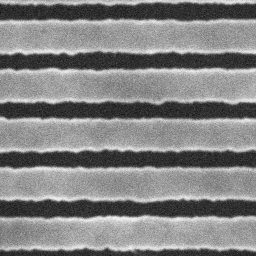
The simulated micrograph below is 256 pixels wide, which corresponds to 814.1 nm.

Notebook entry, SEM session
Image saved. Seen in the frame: lines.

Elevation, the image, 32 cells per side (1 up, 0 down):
00001110110001001000000000000000
00000000000000000000000000000000
00000000000001010000000000000000
11111111111111111111111111111111
11111111111111111111111111111111
11111111111111111111111111111111
11111111111000011111101111110011
00000000000000000000000000000000
00000000000000000000000000000000
11111111111111111111111111111111
11111111111111111111111111111111
11111111111111111111111111111111
11111111111111111111111111111111
00000000000000000000000000000000
00000000000000000000000000000000
11111111111111111111111111111111
11111111111111111111111111111111
11111111111111111111111111111111
11111111111111111111111111111111
00000000000000000000000000000000
00000000000000000000000000000000
11111111111111111111111111111111
11111111111111111111111111111111
11111111111111111111111111111111
11111111111111111111111111111111
00000000000000000000000000000000
00000000000000000000000000000000
11111111111111111111111111111111
11111111111111111111111111111111
11111111111111111111111111111111
11111111111111111111111111111111
00000000000000000000000000000000